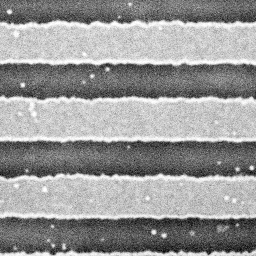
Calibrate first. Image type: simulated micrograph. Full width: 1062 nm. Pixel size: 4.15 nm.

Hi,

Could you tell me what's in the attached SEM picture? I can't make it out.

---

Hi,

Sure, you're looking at lines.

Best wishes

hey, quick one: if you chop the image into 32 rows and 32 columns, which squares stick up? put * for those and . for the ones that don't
................................
................................
................................
********************************
********************************
********************************
********************************
********************************
................................
................................
................................
................................
*****.**************************
********************************
********************************
********************************
********************************
****..***....****.****..********
................................
................................
................................
................................
********************************
********************************
********************************
********************************
********************************
................................
................................
................................
................................
................................